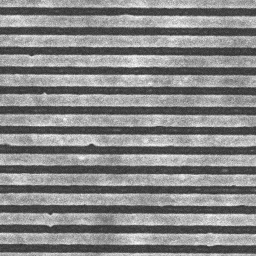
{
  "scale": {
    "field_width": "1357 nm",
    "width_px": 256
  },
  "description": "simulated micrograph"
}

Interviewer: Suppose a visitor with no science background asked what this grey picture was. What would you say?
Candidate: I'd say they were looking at parallel lines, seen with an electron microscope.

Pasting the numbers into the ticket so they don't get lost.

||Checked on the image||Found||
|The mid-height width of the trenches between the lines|42.4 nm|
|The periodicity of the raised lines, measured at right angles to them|105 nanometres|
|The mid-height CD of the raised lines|58.4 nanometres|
